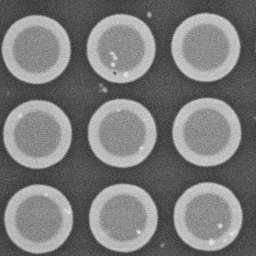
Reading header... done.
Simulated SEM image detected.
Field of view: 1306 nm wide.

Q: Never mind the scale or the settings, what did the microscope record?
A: an array of small figures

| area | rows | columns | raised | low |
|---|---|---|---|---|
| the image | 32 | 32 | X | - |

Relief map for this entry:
--------------------------------
--------------------------------
---XXXX------XXXX------XXXXX----
-XXXXXXX----XXXXXXX---XXXXXXX---
-XXXXXXX---XXXXXXXX---XXXXXXXX--
XXXXXXXXX--XXXXXXXX--XXXXXXXXX--
XXXXXXXXX--XXXXXXXX---XXXXXXXX--
XXXXXXXXX--XXXXXXXX---XXXXXXXX--
-XXXXXXX----XXXXXXX---XXXXXXX---
--XXXXX------XXXXX-----XXXXX----
--------------------------------
--------------------------------
--------------XX---------XX-----
--XXXXX-----XXXXXX-----XXXXXX---
-XXXXXXX----XXXXXXX---XXXXXXXX--
-XXXXXXXX--XXXXXXXX---XXXXXXXX--
XXXXXXXXX--XXXXXXXX---XXXXXXXX--
XXXXXXXXX--XXXXXXXX---XXXXXXXX--
-XXXXXXXX--XXXXXXXX---XXXXXXXX--
-XXXXXXX----XXXXXX-----XXXXXX---
---XXXX------XXXX-------XXX-----
--------------------------------
--------------------------------
---XXXX------XXXX-------XXXX----
--XXXXXX----XXXXXXX----XXXXXX---
-XXXXXXXX---XXXXXXX---XXXXXXXX--
-XXXXXXXX--XXXXXXXXX--XXXXXXXX--
-XXXXXXXX--XXXXXXXXX--XXXXXXXX--
-XXXXXXXX--XXXXXXXX---XXXXXXXX--
-XXXXXXXX---XXXXXXX----XXXXXXX--
--XXXXXX-----XXXXX-----XXXXXX---
----XX--------------------------